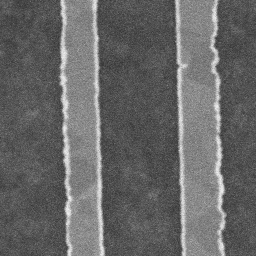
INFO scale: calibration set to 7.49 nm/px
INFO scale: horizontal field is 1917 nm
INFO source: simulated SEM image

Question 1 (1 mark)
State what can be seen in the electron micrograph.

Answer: one or a few lines or trenches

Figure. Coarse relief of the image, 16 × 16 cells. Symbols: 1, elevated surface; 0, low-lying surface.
0000110000011000
0000110000011000
0000110000011000
0000110000011000
0000110000011000
0000110000011100
0000110000011100
0000110000011100
0000110000011100
0000110000011100
0000110000011100
0000110000011100
0000110000011100
0000110000011100
0000110000011100
0000110000011100